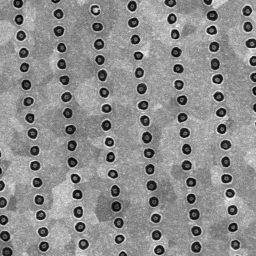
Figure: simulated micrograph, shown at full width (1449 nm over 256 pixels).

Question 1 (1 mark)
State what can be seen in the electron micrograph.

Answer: a regular array of ring-shaped grooves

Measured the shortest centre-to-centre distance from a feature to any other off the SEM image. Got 90.7 nm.